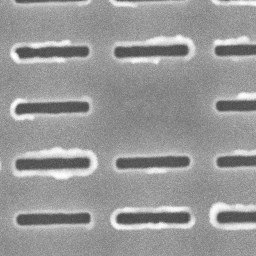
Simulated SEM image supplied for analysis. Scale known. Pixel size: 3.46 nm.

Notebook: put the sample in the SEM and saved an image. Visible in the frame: holes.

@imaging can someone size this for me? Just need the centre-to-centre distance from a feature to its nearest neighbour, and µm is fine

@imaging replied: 0.192